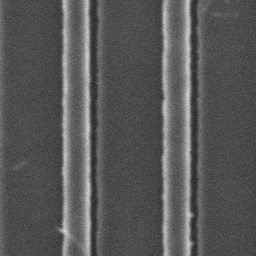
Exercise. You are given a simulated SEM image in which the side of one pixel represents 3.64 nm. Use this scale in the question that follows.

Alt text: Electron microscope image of lines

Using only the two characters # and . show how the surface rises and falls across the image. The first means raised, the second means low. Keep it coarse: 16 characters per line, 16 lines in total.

....#.....##....
....##....##....
....##....##....
....##....##....
....##....##....
....##....##....
....##....##....
....##....##....
....##....##....
....##....##....
....##....##....
....##....##....
....##....##....
....##....##....
....##....##....
....##....##....